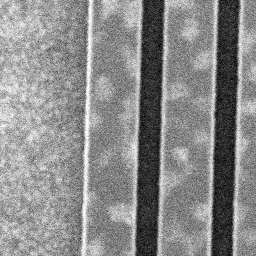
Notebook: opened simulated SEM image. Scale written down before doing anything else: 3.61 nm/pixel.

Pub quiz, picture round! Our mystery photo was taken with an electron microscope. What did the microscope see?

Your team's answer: one or a few lines or trenches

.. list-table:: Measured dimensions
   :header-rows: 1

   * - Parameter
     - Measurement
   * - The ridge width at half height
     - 188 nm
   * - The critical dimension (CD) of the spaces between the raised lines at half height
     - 84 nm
